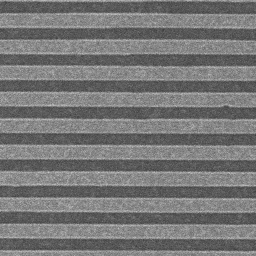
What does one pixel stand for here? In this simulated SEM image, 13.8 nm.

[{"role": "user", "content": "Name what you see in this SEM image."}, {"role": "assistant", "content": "parallel lines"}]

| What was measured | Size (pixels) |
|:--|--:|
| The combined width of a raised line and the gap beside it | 26.3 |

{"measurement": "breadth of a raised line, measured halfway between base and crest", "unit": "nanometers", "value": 176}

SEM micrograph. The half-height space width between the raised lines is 188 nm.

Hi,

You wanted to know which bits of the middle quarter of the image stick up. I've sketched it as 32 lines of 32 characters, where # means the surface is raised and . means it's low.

................................
################################
################################
################################
................................
................................
................................
################################
################################
################################
................................
................................
................................
................................
################################
################################
################################
................................
................................
................................
................................
################################
################################
...#############################
................................
................................
................................
################################
################################
################################
................................
................................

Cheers